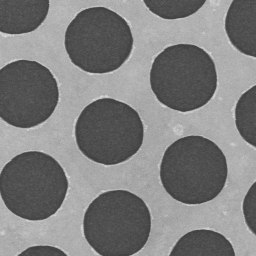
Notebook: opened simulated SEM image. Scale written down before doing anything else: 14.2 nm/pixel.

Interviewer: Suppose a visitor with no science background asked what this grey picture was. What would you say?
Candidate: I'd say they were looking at holes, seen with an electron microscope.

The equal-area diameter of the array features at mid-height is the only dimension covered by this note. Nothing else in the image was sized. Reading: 959 nm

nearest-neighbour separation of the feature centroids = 1310 nanometers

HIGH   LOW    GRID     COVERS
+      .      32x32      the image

......++++++++++++.......++++...
......++++....+++++.....++++....
......+++.......++++++++++++....
.....+++........++++++++++++....
++++++++........+++++++++++++...
++++++++.........++++++++++++...
++++++++........++++......++++..
++.++++++.......+++........+++++
......++++.....++++........+++++
.......++++++++++++........+++++
.......++++++++++++........+++++
.......++++++++++++........++++.
.......+++++..++++++......++++..
.......++++......++++....++++...
......++++.......++++++++++++...
+....+++++........+++++++++++...
+++++++++.........++++++++++++..
++++++++++........++++....+++++.
++++++++++.......++++......+++++
++....+++++.....++++........++++
+......++++++.++++++........++++
........++++++++++++........++++
........++++++++++++........++++
........+++++++++++++.......+++.
........++++.....++++......++++.
+.......+++.......++++++.+++++..
+......++++........+++++++++++..
++++.+++++.........++++++++++++.
++++++++++.........++++++++++++.
+++++++++++........++++.....++++
+++++++++++.......++++.......+++
+++.....++++.....++++........+++